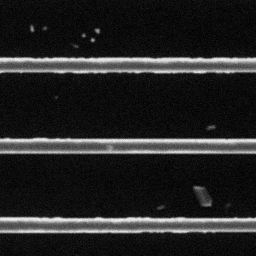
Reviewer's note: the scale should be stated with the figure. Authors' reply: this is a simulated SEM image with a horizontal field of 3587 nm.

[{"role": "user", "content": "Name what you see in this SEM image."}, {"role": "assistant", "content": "lines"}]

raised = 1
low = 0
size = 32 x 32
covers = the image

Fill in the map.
00000000000000000000000000000000
00000000000000000000000000000000
00000000000000000000000000000000
00000000000000000000000000000000
00000000000000000000000000000000
00000000000000000000000000000000
00000000000000000000000000000000
11111111111111111111111111111111
11111111111111111111111111111111
00000000000000000000000000000000
00000000000000000000000000000000
00000000000000000000000000000000
00000000000000000000000000000000
00000000000000000000000000000000
00000000000000000000000000000000
00000000000000000000000000000000
00000000000000000000000000000000
11111111111111111111111111111111
11111111111111111111111111111111
00000000000000000000000000000000
00000000000000000000000000000000
00000000000000000000000000000000
00000000000000000000000000000000
00000000000000000000000000000000
00000000000000000000000000000000
00000000000000000000000000000000
00000000000000000000000000000000
11111111111111111111111111111111
11111111111111111111111111111111
00000000000000000000000000000000
00000000000000000000000000000000
00000000000000000000000000000000